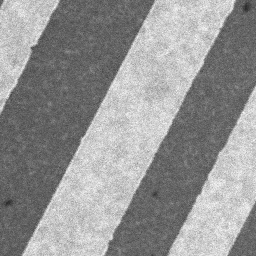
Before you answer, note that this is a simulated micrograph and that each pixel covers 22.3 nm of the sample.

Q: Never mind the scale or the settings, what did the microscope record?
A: one or a few lines or trenches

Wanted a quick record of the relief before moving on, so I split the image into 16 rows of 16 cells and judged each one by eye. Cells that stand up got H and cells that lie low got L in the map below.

HHHLLLLLLLHHHHLL
HHHLLLLLLHHHHHLL
HHLLLLLLHHHHHLLL
HHLLLLLLHHHHHLLL
HLLLLLLHHHHHLLLL
HLLLLLLHHHHHLLLL
LLLLLLHHHHHLLLLH
LLLLLLHHHHHLLLLH
LLLLLHHHHHLLLLHH
LLLLLHHHHHLLLLHH
LLLLHHHHHLLLLHHH
LLLLHHHHHLLLLHHH
LLLHHHHHLLLLHHHH
LLLHHHHHLLLLHHHL
LLHHHHHLLLLHHHHL
LLHHHHHLLLLHHHLL